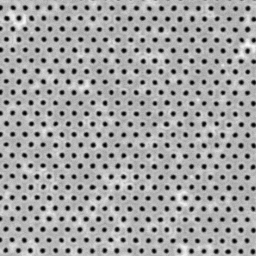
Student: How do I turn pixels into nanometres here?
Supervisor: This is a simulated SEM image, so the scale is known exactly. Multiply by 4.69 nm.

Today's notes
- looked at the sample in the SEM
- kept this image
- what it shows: a regular array of holes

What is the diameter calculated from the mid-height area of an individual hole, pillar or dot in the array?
21.8 nanometres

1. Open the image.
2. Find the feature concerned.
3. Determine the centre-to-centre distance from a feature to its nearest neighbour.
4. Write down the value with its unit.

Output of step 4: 0.0558 microns